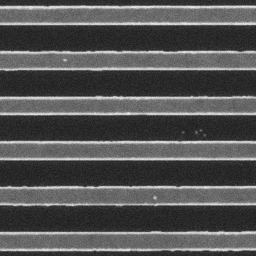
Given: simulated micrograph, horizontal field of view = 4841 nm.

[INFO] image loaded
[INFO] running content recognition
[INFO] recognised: lines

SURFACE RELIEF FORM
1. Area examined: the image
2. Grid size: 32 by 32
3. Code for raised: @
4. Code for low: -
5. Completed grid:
--------------------------------
@@@@@@@@@@@@@@@@@@@@@@@@@@@@@@@@
@@@@@@@@@@@@@@@@@@@@@@@@@@@@@@@@
--------------------------------
--------------------------------
--------------------------------
----------------------------@---
@@@@@@@@@@@@@@@@@@@@@@@@@@@@@@@@
@@@@@@@@@@@@@@@@@@@@@@@@@@@@@@@@
--------------------------------
--------------------------------
--------------------------------
@@@@@@@@@@@@@@@@@@@@@@@@@@@@@@@@
@@@@@@@@@@@@@@@@@@@@@@@@@@@@@@@@
--------------------------------
--------------------------------
--------------------------------
--------------------------------
@@@@@@@@@@@@@@@@@@@@@@@@@@@@@@@@
@@@@@@@@@@@@@@@@@@@@@@@@@@@@@@@@
--------------------------------
--------------------------------
--------------------------------
@@@@@@@@@@@@@@@@@@@@@@@@@@@@@@@@
@@@@@@@@@@@@@@@@@@@@@@@@@@@@@@@@
@@@@@@@@@@@@@@@@@@@@@@@@@@@@@@@@
--------------------------------
--------------------------------
--------------------------------
@@@@@@@@@@@@@@@@@@@@@@@@@@@@@@@@
@@@@@@@@@@@@@@@@@@@@@@@@@@@@@@@@
--------------------------------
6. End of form